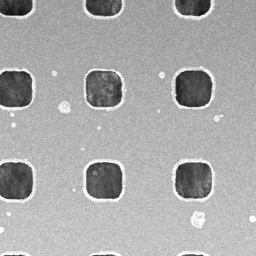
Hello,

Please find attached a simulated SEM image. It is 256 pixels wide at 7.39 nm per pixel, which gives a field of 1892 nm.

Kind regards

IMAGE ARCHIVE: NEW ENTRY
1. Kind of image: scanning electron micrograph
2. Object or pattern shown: holes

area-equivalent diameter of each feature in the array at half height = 40.2 pixels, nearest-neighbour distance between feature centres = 662 nm